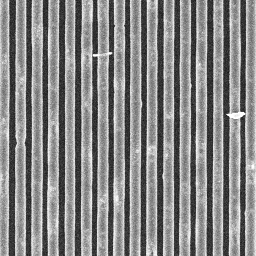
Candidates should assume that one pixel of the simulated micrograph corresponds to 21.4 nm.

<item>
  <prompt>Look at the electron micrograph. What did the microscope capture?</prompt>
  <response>parallel lines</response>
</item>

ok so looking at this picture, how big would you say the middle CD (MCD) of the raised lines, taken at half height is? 225 nm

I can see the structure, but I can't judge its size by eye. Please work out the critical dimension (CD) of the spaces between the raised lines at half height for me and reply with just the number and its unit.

123 nm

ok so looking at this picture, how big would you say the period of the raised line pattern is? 352 nm